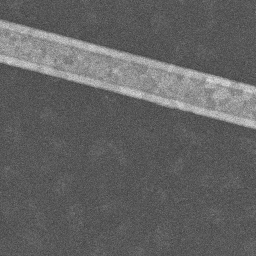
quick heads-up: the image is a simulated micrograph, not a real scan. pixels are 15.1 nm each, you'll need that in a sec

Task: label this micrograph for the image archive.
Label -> one or a few lines or trenches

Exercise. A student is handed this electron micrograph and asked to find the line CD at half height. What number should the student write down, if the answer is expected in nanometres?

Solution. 503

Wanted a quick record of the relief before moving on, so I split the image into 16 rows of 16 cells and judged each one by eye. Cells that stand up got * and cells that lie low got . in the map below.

................
................
****............
********........
...*********....
.......********.
...........*****
...............*
................
................
................
................
................
................
................
................